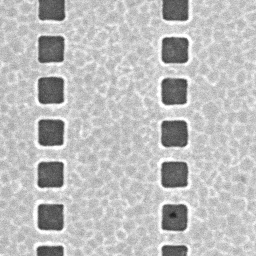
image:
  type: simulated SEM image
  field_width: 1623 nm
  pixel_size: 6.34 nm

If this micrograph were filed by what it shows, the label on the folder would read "a regular array of holes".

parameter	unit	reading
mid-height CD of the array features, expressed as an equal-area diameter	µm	0.194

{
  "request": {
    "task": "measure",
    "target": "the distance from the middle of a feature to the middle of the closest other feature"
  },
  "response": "263 nm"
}